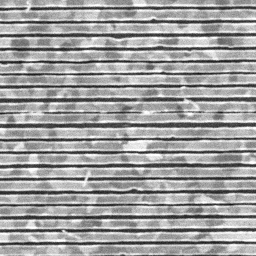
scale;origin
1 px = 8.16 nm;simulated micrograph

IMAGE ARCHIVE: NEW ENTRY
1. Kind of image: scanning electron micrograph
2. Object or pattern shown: parallel lines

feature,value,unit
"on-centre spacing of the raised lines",0.106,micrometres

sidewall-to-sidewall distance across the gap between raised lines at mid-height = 39.8 nanometres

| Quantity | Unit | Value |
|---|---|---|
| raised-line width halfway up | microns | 0.0724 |